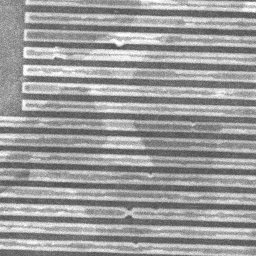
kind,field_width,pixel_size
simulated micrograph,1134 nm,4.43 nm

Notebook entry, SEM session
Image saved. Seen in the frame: parallel lines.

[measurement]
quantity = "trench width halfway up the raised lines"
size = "8.37 px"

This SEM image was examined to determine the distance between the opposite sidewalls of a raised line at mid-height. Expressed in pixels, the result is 9.26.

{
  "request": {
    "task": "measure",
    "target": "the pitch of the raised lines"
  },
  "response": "77.5 nanometers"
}